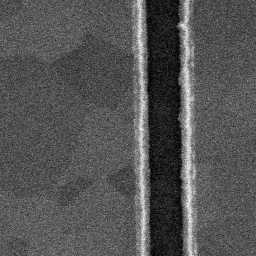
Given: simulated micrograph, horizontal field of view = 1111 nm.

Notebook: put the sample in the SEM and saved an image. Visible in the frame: one or a few lines or trenches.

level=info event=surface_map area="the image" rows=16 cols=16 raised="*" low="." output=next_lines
*********...****
*********...****
*********...****
*********...****
*********...****
*********...****
*********...****
*********...****
*********...****
*********...****
*********...****
*********...****
*********...****
*********...****
*********...****
*********...****